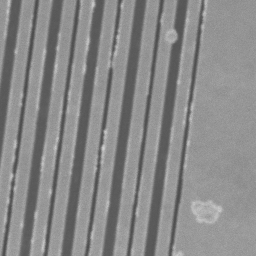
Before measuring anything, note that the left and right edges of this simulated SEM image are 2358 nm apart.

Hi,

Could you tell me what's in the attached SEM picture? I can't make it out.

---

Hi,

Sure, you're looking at parallel lines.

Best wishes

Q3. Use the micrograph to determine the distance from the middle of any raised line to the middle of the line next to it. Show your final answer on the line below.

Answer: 0.192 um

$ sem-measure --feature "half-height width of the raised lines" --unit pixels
13.9